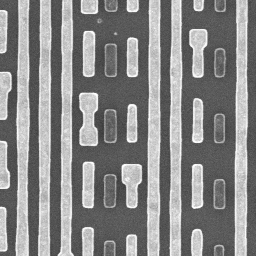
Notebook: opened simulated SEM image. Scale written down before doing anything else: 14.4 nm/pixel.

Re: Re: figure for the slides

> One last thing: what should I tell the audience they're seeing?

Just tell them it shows wiring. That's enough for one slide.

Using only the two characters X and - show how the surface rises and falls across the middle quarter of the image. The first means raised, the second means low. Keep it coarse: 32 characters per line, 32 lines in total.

XX---XX---XXX---XX---XXX---XX---
XX---XX---XXX---XX---XXX---XX---
XX---XX---XXX---XX---XXX---XX---
XX-------------------XXX---XX---
XX-------------------XXX---XX---
XX-------------------XXX---XX---
XX-------------------XXX---XX---
XX--XXXX-------------XXX---XX---
XX--XXXX-------------XXX---XX---
XX--XXXX-------------XXX---XX---
XX--XXXX--------XX---XXX---XX---
XX--XXXX---XX---XX---XXX---XX---
XX---XX---XXX---XX---XXX---XX---
XX---XX---XXX---XX---XXX---XX---
XX---XX---XXX---XX---XXX---XX---
XX---XXX--XXX---XX---XXX---XX---
XX--XXXX--XXX---XX---XXX---XX---
XX--XXXX--XXX---XX---XXX---XX---
XX--XXXX--XXX---XX---XXX---XX---
XX--XXXX---XX--------XXX---XX---
XX-------------------XXX---XX---
XX-------------------XXX---XX---
XX-------------------XXX---XX---
XX-------------------XXX---XX---
XX-------------------XXX---XX---
XX---XX--------XXXX--XXX---XX---
XX---XX--------XXXX--XXX---XX---
XX---XX--------XXXX--XXX---XX---
XX---XX---XXX--XXXX--XXX---XX---
XX---XX---XXX--XXXX--XXX---XX---
XX---XX---XXX---XX---XXX---XX---
XX---XX---XXX---XX---XXX---XX---